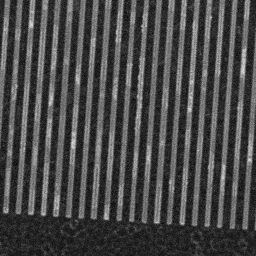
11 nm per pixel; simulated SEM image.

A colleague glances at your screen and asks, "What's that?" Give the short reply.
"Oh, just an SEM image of parallel lines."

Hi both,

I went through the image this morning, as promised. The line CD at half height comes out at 41.3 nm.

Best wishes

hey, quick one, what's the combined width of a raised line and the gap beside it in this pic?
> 0.139 micrometres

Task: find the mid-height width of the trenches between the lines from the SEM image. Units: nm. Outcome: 92.3